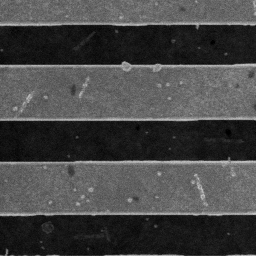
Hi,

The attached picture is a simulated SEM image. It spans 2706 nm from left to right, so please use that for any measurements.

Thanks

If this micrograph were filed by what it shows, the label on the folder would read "lines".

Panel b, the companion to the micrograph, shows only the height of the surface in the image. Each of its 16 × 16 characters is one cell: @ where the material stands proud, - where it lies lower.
@@@@@@@@@@@@@@@@
@@@@@@@@@@@@@@@@
----------------
----------------
@@@@@@@@@@@@@@@@
@@@@@@@@@@@@@@@@
@@@@@@@@@@@@@@@@
@@@@@@@@@@@@----
----------------
----------------
@@@@@@@@@@@@@@@@
@@@@@@@@@@@@@@@@
@@@@@@@@@@@@@@@@
----------------
----------------
----------------